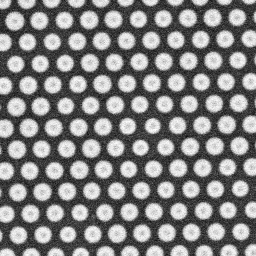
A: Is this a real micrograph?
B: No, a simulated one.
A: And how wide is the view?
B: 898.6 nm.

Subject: an array of small figures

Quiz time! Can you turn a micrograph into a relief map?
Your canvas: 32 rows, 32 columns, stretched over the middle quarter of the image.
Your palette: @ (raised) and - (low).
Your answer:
@@---@@@---@@@---@@@@--@@@@--@@@
@----@@@----@-------------------
--------------------------------
--@@@---@@@---@@@---@@@@--@@@@--
-@@@@---@@@@--@@@@--@@@@--@@@@--
-@@@@---@@@@--@@@@--@@@@--@@@@--
--@@@---@@@---@@@----@@----@@---
--------------------------------
------@@----@@----@@----@@----@@
@@---@@@---@@@@--@@@@--@@@@--@@@
@@---@@@@--@@@@--@@@@--@@@@--@@@
@@---@@@---@@@---@@@----@@@---@@
--------------------------------
----------------------------@---
--@@@---@@@---@@@@---@@@---@@@--
--@@@@--@@@@--@@@@--@@@@--@@@@--
--@@@@--@@@@--@@@@---@@@---@@@--
--@@@----@@---------------------
--------------------------------
@@---@@@----@@----@@----@@@---@@
@@@--@@@@--@@@@--@@@@---@@@--@@@
@@@--@@@@--@@@@--@@@@---@@@---@@
@@---@@@@--@@@----@@----@@----@@
--------------------------------
---@@----@@----@@----@@----@@@--
--@@@@--@@@@--@@@@---@@@---@@@@-
--@@@@--@@@@--@@@@--@@@@---@@@@-
--@@@@--@@@@--@@@@---@@@---@@@--
---@@---------------------------
-------------------------------@
@@---@@@----@@@---@@@---@@@---@@
@@@--@@@@--@@@@--@@@@---@@@---@@